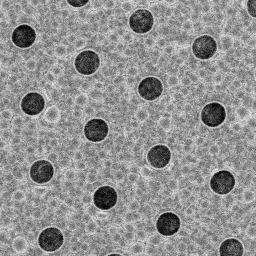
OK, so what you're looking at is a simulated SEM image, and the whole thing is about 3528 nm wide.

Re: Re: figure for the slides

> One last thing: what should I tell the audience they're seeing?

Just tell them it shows a regular array of holes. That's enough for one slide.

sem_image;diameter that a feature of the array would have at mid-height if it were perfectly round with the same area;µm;0.337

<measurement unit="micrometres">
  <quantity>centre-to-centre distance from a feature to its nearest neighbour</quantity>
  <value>0.938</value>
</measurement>